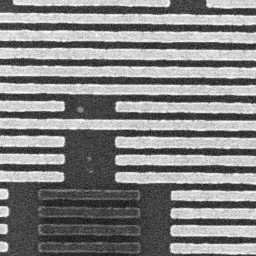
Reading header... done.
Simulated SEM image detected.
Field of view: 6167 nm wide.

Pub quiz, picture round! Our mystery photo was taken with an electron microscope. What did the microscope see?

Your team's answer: wiring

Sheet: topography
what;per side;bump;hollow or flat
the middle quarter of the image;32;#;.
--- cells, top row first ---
................................
################################
################################
................................
................................
#############################...
################################
................................
................................
................................
.............###################
.............###################
................................
................................
################################
################################
................................
................................
.............#.....##...........
.............###################
.............###################
................................
................................
.............###################
.............###################
................................
................................
.............###################
.............###################
..............##################
................................
................................